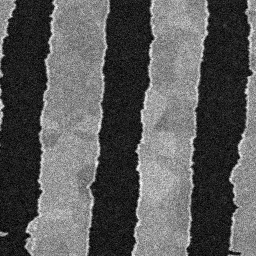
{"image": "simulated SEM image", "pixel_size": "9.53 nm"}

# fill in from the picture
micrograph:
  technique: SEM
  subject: one or a few lines or trenches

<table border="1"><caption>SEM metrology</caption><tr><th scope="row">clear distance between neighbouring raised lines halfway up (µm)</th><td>0.434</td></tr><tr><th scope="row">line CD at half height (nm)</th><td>506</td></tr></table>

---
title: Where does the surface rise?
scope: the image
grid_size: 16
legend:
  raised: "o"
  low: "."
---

o..oooo..oooo..o
...oooo...ooo...
...oooo...ooo...
...ooo...oooo...
...ooo...ooo....
...ooo...ooo...o
...ooo...ooo...o
...ooo...ooo...o
...ooo...ooo...o
...ooo...ooo...o
...ooo...ooo...o
...ooo...ooo...o
...ooo...ooo...o
..oooo...ooo...o
..oooo..oooo...o
..ooo...oooo...o